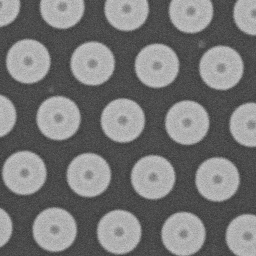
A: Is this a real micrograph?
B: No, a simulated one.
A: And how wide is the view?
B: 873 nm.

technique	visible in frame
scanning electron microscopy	an array of small figures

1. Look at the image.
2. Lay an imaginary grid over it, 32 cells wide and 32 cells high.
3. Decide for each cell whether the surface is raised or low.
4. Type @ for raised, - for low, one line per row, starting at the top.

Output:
@@---@@@@@---@@@@@---@@@@@---@@@
@@---@@@@@---@@@@@---@@@@@@--@@@
@@----@@@@----@@@@---@@@@@---@@@
-------@-------@@-----@@@@----@@
--------------------------------
--@@@-----@@@-------------------
-@@@@@---@@@@@----@@@@----@@@---
-@@@@@---@@@@@---@@@@@---@@@@@--
-@@@@@---@@@@@---@@@@@---@@@@@--
--@@@@---@@@@@---@@@@@---@@@@@--
-----------@------@@@-----@@@---
--------------------------------
@-----@@@------@----------------
@@---@@@@@---@@@@@---@@@@-----@@
@@---@@@@@---@@@@@---@@@@@---@@@
@@---@@@@@---@@@@@---@@@@@---@@@
@----@@@@----@@@@@---@@@@@---@@@
--------------@@@-----@@@-----@@
--------------------------------
-@@@@-----@@--------------------
-@@@@----@@@@----@@@@----@@@@---
@@@@@@--@@@@@@--@@@@@@---@@@@@--
@@@@@@--@@@@@@--@@@@@@---@@@@@--
-@@@@----@@@@----@@@@----@@@@@--
----------@@------@@@----@@@@---
--------------------------------
@----@@@------@@----------------
@---@@@@@----@@@@----@@@@----@@@
@---@@@@@@--@@@@@@--@@@@@---@@@@
@---@@@@@---@@@@@@--@@@@@@--@@@@
@----@@@@----@@@@----@@@@---@@@@
--------------@@-----@@@-----@@@